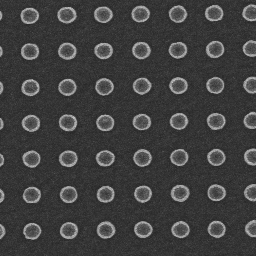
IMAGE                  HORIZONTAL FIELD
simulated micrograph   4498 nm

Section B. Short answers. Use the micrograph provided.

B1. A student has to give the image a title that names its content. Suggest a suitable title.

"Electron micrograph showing a regular array of raised bodies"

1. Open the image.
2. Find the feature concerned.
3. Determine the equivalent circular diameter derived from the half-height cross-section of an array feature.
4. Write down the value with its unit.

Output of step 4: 285 nm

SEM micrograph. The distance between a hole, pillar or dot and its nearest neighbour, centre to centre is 0.629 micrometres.